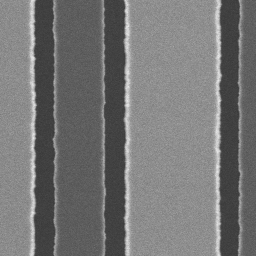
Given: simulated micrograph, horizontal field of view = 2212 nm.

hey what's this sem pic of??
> lines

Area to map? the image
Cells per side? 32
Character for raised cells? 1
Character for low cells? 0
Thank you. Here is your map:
11110001111110001111111111110011
11110001111110001111111111110011
11110001111110001111111111100011
11110001111110001111111111110011
11110001111110001111111111110011
11110001111110011111111111110011
11110001111110001111111111110011
11110001111110001111111111110011
11110001111110001111111111110011
11110001111110001111111111110011
11110001111110001111111111100011
11110001111110001111111111100011
11110001111110001111111111110011
11111001111110001111111111110011
11110001111110001111111111110011
11110001111110001111111111110011
11110001111110001111111111110011
11110001111110001111111111110011
11110001111110001111111111110011
11110001111110001111111111110011
11110001111110001111111111110011
11110001111110001111111111100011
11110001111110001111111111100011
11110001111110001111111111100011
11110001111110001111111111110011
11110001111110001111111111100011
11110001111110001111111111110011
11110001111110001111111111110011
11110001111110001111111111110011
11110001111110001111111111110011
11110001111110001111111111100011
11110001111110001111111111110011